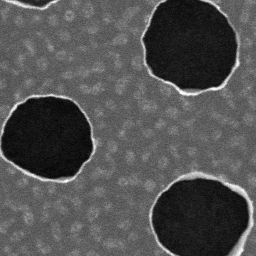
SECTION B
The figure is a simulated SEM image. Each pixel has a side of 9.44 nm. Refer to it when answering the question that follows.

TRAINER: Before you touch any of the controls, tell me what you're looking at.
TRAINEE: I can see holes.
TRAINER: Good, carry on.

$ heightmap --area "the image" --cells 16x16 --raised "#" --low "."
##########....##
#########.....##
#########......#
#########......#
#########.....##
###########..###
#....###########
.....###########
......##########
......##########
#....###########
###########...##
##########.....#
##########......
##########.....#
##########.....#